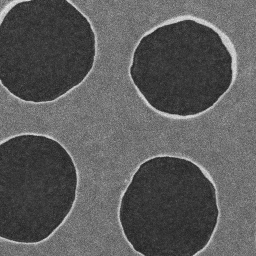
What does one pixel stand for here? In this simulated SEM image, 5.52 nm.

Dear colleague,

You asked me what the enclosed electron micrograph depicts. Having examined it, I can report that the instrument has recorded holes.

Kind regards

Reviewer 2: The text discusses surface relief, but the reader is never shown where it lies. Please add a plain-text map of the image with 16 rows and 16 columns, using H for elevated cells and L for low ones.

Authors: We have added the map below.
HLLLLHHHHHHHHHHH
LLLLLLHHHHHLLHHH
LLLLLLHHHLLLLLHH
LLLLLLHHLLLLLLLH
LLLLLLHHLLLLLLLH
LLLLLHHHHLLLLLHH
HHHHHHHHHLLLLHHH
HHHHHHHHHHHHHHHH
HLHHHHHHHHHHHHHH
LLLLHHHHHHHHHHHH
LLLLLHHHHLLLHHHH
LLLLLHHHLLLLLHHH
LLLLLHHHLLLLLLHH
LLLLHHHHLLLLLLHH
LLLHHHHHLLLLLHHH
HHHHHHHHLLLLLHHH